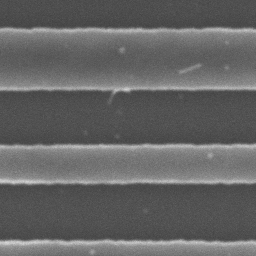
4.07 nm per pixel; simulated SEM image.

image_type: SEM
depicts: lines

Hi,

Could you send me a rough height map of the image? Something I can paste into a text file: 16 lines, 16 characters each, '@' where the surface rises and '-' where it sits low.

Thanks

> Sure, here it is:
----------------
----------------
@@@@@@@@@@@@@@@@
@@@@@@@@@@@@@@@@
@@@@@@@@@@@@@@@@
@@@@@@@@@@@@@@@@
----------------
----------------
----------------
@@@@@@@@@@@@@@@@
@@@@@@@@@@@@@@@@
----------------
----------------
----------------
----------------
@@@@@@@@@@@@@@@@